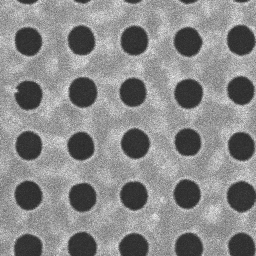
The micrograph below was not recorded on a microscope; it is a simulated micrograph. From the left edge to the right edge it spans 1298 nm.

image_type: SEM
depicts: a regular array of holes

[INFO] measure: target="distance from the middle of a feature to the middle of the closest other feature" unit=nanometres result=260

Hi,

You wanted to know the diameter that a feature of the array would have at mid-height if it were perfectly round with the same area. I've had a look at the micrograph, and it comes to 146 nm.